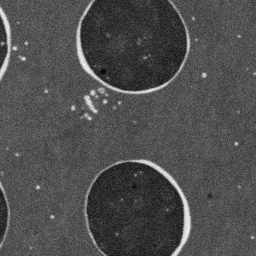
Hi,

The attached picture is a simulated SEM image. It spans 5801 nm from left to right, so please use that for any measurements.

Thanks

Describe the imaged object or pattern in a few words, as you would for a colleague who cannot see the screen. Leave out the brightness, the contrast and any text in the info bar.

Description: holes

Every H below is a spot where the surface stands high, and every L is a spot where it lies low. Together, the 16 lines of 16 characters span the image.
HHHHHHLLLLLHHHHH
HHHHHLLLLLLHHHHH
LHHHHLLLLLLLHHHH
HHHHHLLLLLLLHHHH
HHHHHHLLLLLHHHHH
HHHHHHHLLLHHHHHH
HHHHHHHHHHHHHHHH
HHHHHHHHHHHHHHHH
HHHHHHHHHHHHHHHH
HHHHHHHHHHHHHHHH
HHHHHHHLLLHHHHHH
HHHHHHLLLLLHHHHH
HHHHHLLLLLLHHHHH
HHHHHLLLLLLLHHHH
HHHHHHLLLLLLHHHH
HHHHHHLLLLLHHHHH